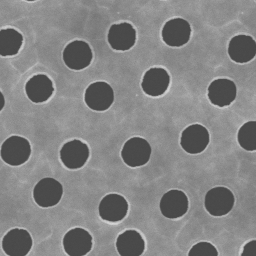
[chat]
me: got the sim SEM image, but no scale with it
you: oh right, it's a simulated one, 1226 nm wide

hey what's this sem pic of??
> a regular array of holes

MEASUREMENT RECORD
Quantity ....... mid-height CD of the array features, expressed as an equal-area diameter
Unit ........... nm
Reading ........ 136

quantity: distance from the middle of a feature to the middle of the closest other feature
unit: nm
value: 237